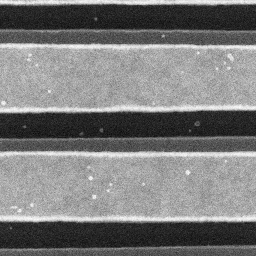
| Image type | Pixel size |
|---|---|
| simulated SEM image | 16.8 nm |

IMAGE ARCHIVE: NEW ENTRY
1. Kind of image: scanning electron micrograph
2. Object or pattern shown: lines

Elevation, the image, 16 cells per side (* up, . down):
................
................
................
****************
****************
****************
****************
................
................
*******.***...**
****************
****************
****************
****************
................
................